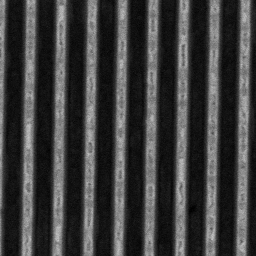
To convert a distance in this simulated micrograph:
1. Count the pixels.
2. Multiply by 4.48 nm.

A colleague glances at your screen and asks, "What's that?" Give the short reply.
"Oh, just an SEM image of parallel lines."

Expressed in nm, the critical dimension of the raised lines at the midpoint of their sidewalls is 54.3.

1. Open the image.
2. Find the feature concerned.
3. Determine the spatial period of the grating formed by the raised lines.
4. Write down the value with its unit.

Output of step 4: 137 nm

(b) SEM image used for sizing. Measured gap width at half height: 84.5 nm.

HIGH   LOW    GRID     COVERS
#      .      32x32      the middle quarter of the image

#.....##.....###.....##.....###.
#.....##.....###.....##.....###.
#....###.....###.....##.....###.
#....###.....###.....##.....###.
#....###.....###.....##.....###.
.....###.....###.....##.....###.
.....###.....###.....##.....###.
.....###.....###.....##.....###.
.....###.....###.....##.....###.
.....###.....###.....##.....###.
.....###.....###.....##.....###.
.....###.....###.....##.....###.
.....###.....###.....##.....###.
.....###.....###....###.....###.
.....###.....###....###.....###.
.....###.....###....###.....###.
.....###.....###.....##.....###.
.....###.....###.....##.....###.
.....###.....###.....##.....###.
.....###.....###....###.....###.
.....###.....###....###.....###.
.....###.....###....###.....###.
.....###.....##.....###.....###.
.....###.....##.....###.....###.
.....###.....##.....###.....###.
.....###.....##.....###.....###.
.....###.....##.....###.....###.
.....###.....##.....###.....###.
.....###.....##.....###.....###.
.....###.....##.....###.....###.
.....###.....##.....###.....###.
.....###.....##.....###.....###.